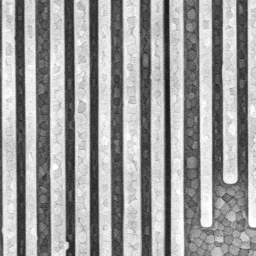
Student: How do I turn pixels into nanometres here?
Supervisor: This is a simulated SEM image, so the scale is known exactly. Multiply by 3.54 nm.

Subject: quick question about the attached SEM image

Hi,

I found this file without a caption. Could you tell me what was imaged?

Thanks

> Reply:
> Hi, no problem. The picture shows parallel lines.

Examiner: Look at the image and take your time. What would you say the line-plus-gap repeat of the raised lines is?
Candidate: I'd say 86.7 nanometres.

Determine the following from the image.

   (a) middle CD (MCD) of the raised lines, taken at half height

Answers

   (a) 46.9 nm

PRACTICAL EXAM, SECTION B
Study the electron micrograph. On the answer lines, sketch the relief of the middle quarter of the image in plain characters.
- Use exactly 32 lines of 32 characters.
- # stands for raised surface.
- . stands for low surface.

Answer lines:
...###...###...####...###..###..
...###...###...####...###..###..
...###...###...####...###..###..
...###...###...####...###..###..
...###...###...####...###..###..
...###...###...####...###..###..
...###...###...####...###..###..
...###...###...####...###..###..
...###...##....####...###..###..
...###...##....####...###..###..
...###...##....####...###..###..
...###...##....####...###..###..
...###...##....####...###..###..
...###...##....####...###..###..
...###...##....####...###..###..
...###...##....####...###..###..
...###...##....####...###..###..
...###...##....####...###..###..
...###...##....####...###..###..
...###...##....####...###..###..
...###...##....####...###..###..
...###...##....####...###..###..
...###...##....####...###..###..
...###...##....####...###..###..
...###...##....####...###..###..
...###...##....####...###..###..
...###...##....####...###..###..
...###...##....####...###..###..
...###...##....####...###..###..
...###...##....####...###..###..
...###...##....####...###..##...
...###...##....####...###..##...